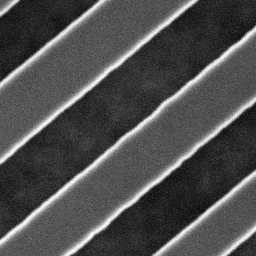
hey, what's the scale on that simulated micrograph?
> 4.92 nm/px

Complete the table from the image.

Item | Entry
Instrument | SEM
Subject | lines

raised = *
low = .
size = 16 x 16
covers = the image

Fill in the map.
*.....******....
.....*****......
...******......*
..******......**
.******......***
******.....*****
****......******
***......******.
**......*****...
*......*****....
.....******.....
....******.....*
...******.....**
..*****......***
.*****.....*****
*****.....*****.